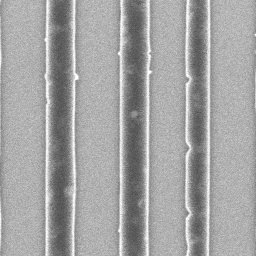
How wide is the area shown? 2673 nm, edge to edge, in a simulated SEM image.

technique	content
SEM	one or a few lines or trenches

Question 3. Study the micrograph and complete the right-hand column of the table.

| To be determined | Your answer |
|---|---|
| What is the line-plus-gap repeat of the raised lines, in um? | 0.718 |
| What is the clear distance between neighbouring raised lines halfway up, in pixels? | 45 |